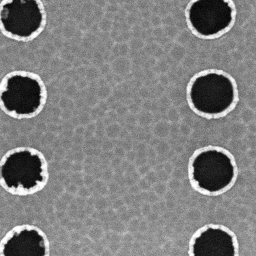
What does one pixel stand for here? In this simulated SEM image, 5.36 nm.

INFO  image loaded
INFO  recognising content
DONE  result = holes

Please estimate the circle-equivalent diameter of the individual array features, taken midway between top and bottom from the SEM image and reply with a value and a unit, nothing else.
218 nm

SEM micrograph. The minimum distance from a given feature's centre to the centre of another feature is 409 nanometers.